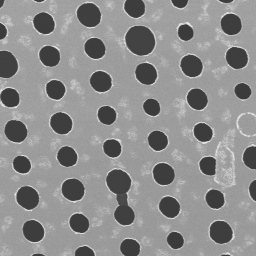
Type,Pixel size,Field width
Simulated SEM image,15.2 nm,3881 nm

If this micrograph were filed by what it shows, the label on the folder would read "a regular array of holes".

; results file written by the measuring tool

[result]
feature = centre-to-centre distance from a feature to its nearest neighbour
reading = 511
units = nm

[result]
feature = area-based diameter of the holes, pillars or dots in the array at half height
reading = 20.9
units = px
